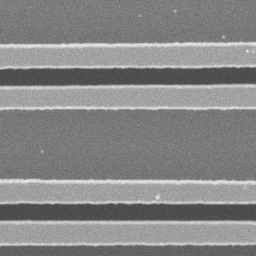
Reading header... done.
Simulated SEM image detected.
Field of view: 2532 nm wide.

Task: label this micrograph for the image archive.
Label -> lines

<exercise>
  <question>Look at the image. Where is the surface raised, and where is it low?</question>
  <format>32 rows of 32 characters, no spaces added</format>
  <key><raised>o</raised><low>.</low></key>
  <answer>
................................
................................
................................
................................
................................
.........ooooooooooooooooooooooo
oooooooooooooooooooooooooooooooo
oooooooooooooooooooooooooooooooo
oooo............................
................................
................................
oooooooooooooooooooooooooooooooo
oooooooooooooooooooooooooooooooo
oooooooooooooooooooooooooooooooo
................................
................................
................................
................................
................................
................................
................................
................................
ooooo...........................
oooooooooooooooooooooooooooooooo
oooooooooooooooooooooooooooooooo
................................
................................
................................
oooooooooooooooooooooooooooooooo
oooooooooooooooooooooooooooooooo
oooooooooooooooooooooooooooooooo
................................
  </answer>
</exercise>